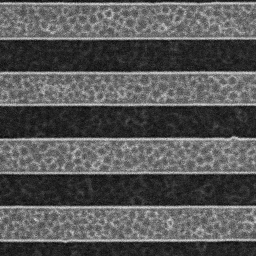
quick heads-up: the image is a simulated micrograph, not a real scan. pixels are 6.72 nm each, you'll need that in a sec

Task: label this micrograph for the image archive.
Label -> one or a few lines or trenches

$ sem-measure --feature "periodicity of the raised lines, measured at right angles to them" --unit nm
454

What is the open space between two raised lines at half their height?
232 nm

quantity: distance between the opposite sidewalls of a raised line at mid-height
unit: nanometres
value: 225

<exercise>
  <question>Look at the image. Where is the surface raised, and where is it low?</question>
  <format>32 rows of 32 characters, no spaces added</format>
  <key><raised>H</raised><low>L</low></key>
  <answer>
LLHHHHHHHHHHHHHHHHHHHHHHHHHHHHHH
HHHHHHHHHHHHHHHHHHHHHHHHHHHHHHHH
HHHHHHHHHHHHHHHHHHHHHHHHHHHHHHHH
HHHHHHHHHHHHHHHHHHHHHHHHHHHHHHHH
HHHHHHHHHHHHHHHHHHHHHHHHHHHHHHHH
LLLLLLLLLLLLLLLLLLLLLLLLLLLLLLLL
LLLLLLLLLLLLLLLLLLLLLLLLLLLLLLLL
LLLLLLLLLLLLLLLLLLLLLLLLLLLLLLLL
LLLLLLLLLLLLLLLLLLLLLLLLLLLLLLLL
HHHHHHHHHHHHHHHHHHHHHHHHHHHHHHHH
HHHHHHHHHHHHHHHHHHHHHHHHHHHHHHHH
HHHHHHHHHHHHHHHHHHHHHHHHHHHHHHHH
HHHHHHHHHHHHHHHHHHHHHHHHHHHHHHHH
LLLLLLLLLLLLLLLLLLLLLLLLLLLLLLLL
LLLLLLLLLLLLLLLLLLLLLLLLLLLLLLLL
LLLLLLLLLLLLLLLLLLLLLLLLLLLLLLLL
LLLLLLLLLLLLLLLLLLLLLLLLLLLLLLLL
LLLLHLHHHHHHHHLLHHHHHHHHHHHHHHHH
HHHHHHHHHHHHHHHHHHHHHHHHHHHHHHHH
HHHHHHHHHHHHHHHHHHHHHHHHHHHHHHHH
HHHHHHHHHHHHHHHHHHHHHHHHHHHHHHHH
HHHHHHHHHHHHHHHHHHHHHHHHHHHHHHHH
LLLLLLLLLLLLLLLLLLLLLLLLLLLLLLLL
LLLLLLLLLLLLLLLLLLLLLLLLLLLLLLLL
LLLLLLLLLLLLLLLLLLLLLLLLLLLLLLLL
LLLLLLLLLLLLLLLLLLLLLLLLLLLLLLLL
HHHHHHHHHHHHHHHHHHHHHHHHHHHHHHHH
HHHHHHHHHHHHHHHHHHHHHHHHHHHHHHHH
HHHHHHHHHHHHHHHHHHHHHHHHHHHHHHHH
HHHHHHHHHHHHHHHHHHHHHHHHHHHHHHHH
LLLLLLLLLLLLLLLLLLLLLLLLLLLLLLLL
LLLLLLLLLLLLLLLLLLLLLLLLLLLLLLLL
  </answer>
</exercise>